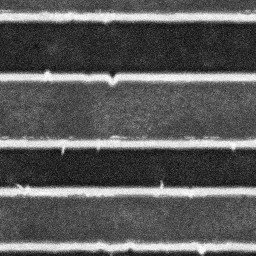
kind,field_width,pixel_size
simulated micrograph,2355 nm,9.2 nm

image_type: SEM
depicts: one or a few lines or trenches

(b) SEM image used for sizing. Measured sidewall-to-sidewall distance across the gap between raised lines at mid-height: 497 nm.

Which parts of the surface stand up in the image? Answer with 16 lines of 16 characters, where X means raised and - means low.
XXXXXXXXXXXXXXXX
----------------
----------------
----------------
----------------
XXXXXXXXXXXXXXXX
XXXXXXXXXXXXXXXX
XXXXXXXXXXXXXXXX
XXXXXXXXXXXXXXXX
----------------
----------------
----------------
XXXXXXXXXXXXXXXX
XXXXXXXXXXXXXXXX
XXXXXXXXXXXXXXXX
----------------